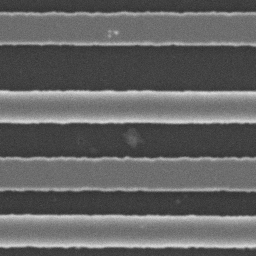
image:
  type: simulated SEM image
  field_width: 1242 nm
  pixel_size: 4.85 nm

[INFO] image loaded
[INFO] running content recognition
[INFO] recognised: lines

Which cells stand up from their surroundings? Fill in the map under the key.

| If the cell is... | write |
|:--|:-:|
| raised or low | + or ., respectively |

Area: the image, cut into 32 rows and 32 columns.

................................
................................
++++++++++++++++++++++++++++++++
++++++++++++++++++++++++++++++++
++++++++++++++++++++++++++++++++
.........+++++++++++++++++++++++
................................
................................
................................
................................
................................
++..++++++++.++.+++....+........
++++++++++++++++++++++++++++++++
++++++++++++++++++++++++++++++++
++++++++++++++++++++++++++++++++
................................
................................
................................
................................
................................
++++++++++++++++++++++++++++++++
++++++++++++++++++++++++++++++++
++++++++++++++++++++++++++++++++
++++++++++++++++++++++++++++++++
................................
................................
................................
++++++++++++++++++++++++++++++++
++++++++++++++++++++++++++++++++
++++++++++++++++++++++++++++++++
++++++++++++++++++++++++++++++++
................................